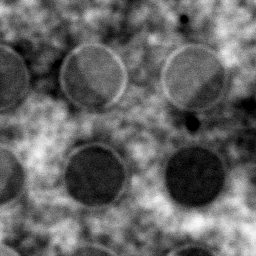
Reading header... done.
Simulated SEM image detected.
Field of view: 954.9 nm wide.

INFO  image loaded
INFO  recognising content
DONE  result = raised bodies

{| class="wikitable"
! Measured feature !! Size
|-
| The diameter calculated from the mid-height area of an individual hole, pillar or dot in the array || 242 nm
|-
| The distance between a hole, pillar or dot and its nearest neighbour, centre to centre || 99.1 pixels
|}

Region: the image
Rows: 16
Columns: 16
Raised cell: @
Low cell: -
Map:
----------------
----------------
----------------
@---@@@----@@@--
@@--@@@@--@@@@--
@@--@@@@--@@@@--
@----@@----@@---
----------------
----------------
@----@@----@@---
@---@@@@--@@@@--
@@--@@@@--@@@@--
@---@@@----@@---
----------------
----------------
@----@@----@@---